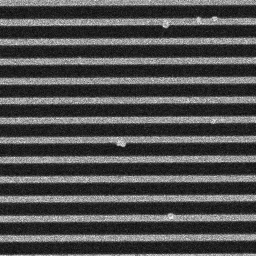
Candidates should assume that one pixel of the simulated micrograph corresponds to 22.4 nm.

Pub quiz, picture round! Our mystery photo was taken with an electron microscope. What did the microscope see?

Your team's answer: parallel lines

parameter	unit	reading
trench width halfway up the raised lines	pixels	11.2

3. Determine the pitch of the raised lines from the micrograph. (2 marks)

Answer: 19.6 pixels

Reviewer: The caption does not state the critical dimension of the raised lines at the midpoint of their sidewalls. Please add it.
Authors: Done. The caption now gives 8.63 px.